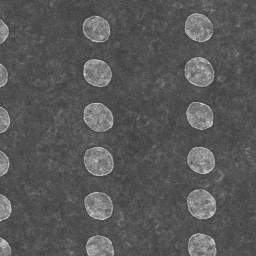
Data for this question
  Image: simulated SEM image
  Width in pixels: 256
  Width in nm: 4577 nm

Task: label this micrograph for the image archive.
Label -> a regular array of raised bodies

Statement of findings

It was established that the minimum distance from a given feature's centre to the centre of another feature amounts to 784 nanometers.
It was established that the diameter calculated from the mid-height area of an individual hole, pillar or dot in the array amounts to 490 nanometres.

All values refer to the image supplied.